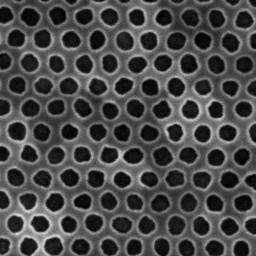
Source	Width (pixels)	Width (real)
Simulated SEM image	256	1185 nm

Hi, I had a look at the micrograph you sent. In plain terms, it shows a regular array of holes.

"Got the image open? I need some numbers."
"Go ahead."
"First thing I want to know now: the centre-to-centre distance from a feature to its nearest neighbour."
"25.4 pixels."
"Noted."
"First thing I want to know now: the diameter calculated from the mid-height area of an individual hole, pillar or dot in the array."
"0.0839 µm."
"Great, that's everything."